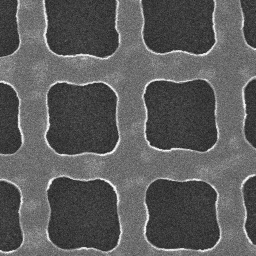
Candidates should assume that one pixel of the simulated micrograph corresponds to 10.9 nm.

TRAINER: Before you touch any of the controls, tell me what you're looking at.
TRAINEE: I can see holes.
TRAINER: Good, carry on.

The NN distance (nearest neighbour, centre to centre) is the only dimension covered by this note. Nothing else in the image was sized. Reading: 1060 nanometers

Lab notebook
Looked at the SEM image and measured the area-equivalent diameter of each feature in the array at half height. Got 0.837 micrometres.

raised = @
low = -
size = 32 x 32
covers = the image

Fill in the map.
--@@@@---------@@@---------@@@--
--@@@@--------@@@@---------@@@--
--@@@@--------@@@@---------@@@@-
--@@@@--------@@@@---------@@@--
--@@@@---------@@@---------@@@@-
--@@@@---------@@@---------@@@@-
--@@@@@-------@@@@@--@@@--@@@@@@
@@@@@@@@@@@@@@@@@@@@@@@@@@@@@@@@
@@@@@@@@@@@@@@@@@@@@@@@@@@@@@@@@
@@@@@@@@@@@@@@@@@@@@@@@@@@@@@@@@
-@@@@@@--@@--@@@@@@-------@@@@@-
--@@@@--------@@@@---------@@@@-
--@@@@---------@@@---------@@@@-
--@@@@--------@@@@---------@@@@-
--@@@@---------@@@---------@@@@-
--@@@@---------@@@---------@@@@-
---@@@---------@@@---------@@@@-
---@@@---------@@@---------@@@@-
--@@@@@-------@@@@@@------@@@@@@
@@@@@@@@@@@@@@@@@@@@@@@@@@@@@@@@
@@@@@@@@@@@@@@@@@@@@@@@@@@@@@@@@
@@@@@@@@@@@@@@@@@@@@@@@@@@@@@@@@
@@@@@@@--@@@-@@@@@@@-@@@@@@@@@@-
--@@@@--------@@@@---------@@@--
---@@@---------@@@---------@@@--
---@@@---------@@@---------@@@@-
--@@@@---------@@@@--------@@@@-
---@@@---------@@@@--------@@@@-
---@@@---------@@@---------@@@@-
---@@@---------@@@---------@@@@-
---@@@@--------@@@@--------@@@@@
@@@@@@@@@@@@@@@@@@@@@@@@@@@@@@@@